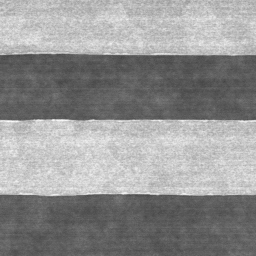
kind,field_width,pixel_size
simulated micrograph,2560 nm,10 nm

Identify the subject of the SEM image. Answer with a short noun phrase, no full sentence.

one or a few lines or trenches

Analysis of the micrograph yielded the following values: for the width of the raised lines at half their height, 740 nm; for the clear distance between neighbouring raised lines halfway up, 656 nm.